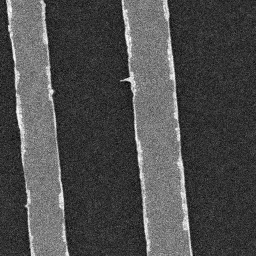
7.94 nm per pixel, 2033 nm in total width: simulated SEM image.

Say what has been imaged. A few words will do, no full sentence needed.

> one or a few lines or trenches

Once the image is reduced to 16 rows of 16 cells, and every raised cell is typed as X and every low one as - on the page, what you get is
XXX-----XX------
-XX-----XXX-----
-XX-----XXX-----
-XX-----XXX-----
-XX-----XXX-----
-XX-----XXX-----
-XX-----XXX-----
-XX-----XXX-----
-XX------XX-----
-XXX-----XX-----
-XXX-----XX-----
--XX-----XX-----
--XX-----XXX----
--XX-----XXX----
--XX-----XXX----
--XX-----XXX----